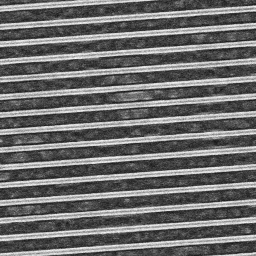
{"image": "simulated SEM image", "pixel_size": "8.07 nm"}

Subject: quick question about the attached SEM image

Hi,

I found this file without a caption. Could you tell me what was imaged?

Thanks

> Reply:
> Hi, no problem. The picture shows parallel lines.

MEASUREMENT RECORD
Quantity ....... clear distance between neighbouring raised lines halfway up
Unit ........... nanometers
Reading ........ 112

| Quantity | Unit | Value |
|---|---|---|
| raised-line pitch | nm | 142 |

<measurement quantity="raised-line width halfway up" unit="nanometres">30.2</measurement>